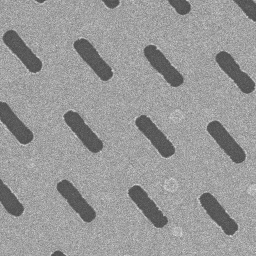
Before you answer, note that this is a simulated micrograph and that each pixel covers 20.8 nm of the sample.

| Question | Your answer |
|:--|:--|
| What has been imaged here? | a regular array of holes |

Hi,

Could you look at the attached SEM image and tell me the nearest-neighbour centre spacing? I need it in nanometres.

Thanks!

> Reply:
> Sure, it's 1470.